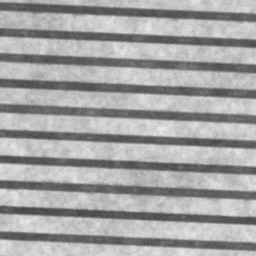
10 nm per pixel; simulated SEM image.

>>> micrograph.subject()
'parallel lines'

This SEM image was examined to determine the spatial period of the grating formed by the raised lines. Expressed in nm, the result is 254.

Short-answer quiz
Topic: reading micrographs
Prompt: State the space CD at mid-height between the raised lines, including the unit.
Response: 90.2 nm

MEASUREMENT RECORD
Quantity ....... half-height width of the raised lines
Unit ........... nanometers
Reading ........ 160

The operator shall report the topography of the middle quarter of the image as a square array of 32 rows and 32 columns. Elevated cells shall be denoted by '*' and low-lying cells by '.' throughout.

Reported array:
***.............................
*************************.......
********************************
********************************
.......*************************
..............................**
................................
*******************.............
********************************
********************************
..******************************
........................********
................................
********........................
******************************..
********************************
********************************
.............*******************
................................
*******.........................
******************************..
********************************
********************************
.*******************************
........................********
................................
*******************.............
********************************
********************************
.*******************************
.......................*********
................................